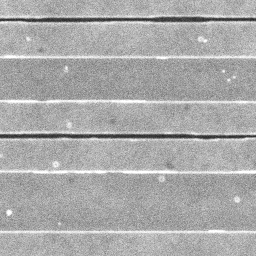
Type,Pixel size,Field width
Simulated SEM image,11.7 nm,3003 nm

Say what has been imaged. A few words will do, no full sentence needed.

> lines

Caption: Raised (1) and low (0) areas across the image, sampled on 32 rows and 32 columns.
11111111111111111111111111111111
11111111111111111111111111111111
11111100000111111110000000111111
11111111111111111111111111111111
11111111111111111111111111111111
11111111111111111111111111111111
11111111111111111111111111111111
00000000000000000000000000000000
00000000000000000000000000000000
00000000000000000000000000000000
00000000000000000000000000000000
00000000000000000000000000000000
00000000000000000000000000000000
11111111111111111111111111111111
11111111111111111111111111111111
11111111111111111111111111111111
11111111111111111111111111111111
11111111111111111111111111111111
11111111111111111111111111111111
11111111111111111111111111111111
11111111111111111111111111111111
00001111000000001110111111111111
00000000000000000000000000000000
00000000000000000000000000000000
00000000000000000000000000000000
00000000000000000000000000000000
00000000000000000000000000000000
00000000000000000000000000000000
00000000000000000000000000000000
11111111111111111111111111111111
11111111111111111111111111111111
11111111111111111111111111111111